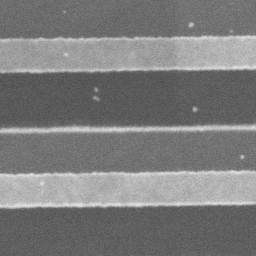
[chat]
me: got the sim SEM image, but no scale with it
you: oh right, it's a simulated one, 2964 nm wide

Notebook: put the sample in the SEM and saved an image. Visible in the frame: lines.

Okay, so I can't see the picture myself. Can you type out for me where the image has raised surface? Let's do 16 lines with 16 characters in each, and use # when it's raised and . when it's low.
################
################
################
################
#...............
................
................
................
################
################
################
################
################
................
................
................